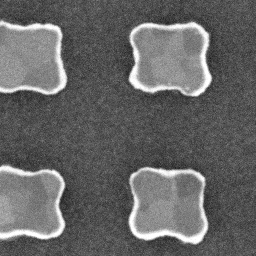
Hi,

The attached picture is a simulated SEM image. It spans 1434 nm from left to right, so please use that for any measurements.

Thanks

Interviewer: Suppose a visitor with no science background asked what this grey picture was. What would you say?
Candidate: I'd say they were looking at raised bodies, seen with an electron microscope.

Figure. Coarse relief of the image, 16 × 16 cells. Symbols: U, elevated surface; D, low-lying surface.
DDDDDDDDDDDDDDDD
UDDDDDDDDDDDDDDD
UUUUDDDDUUUUUDDD
UUUUDDDDUUUUUDDD
UUUUDDDDUUUUUDDD
UUUUDDDDDUUUUDDD
DDDDDDDDDDDDDDDD
DDDDDDDDDDDDDDDD
DDDDDDDDDDDDDDDD
DDDDDDDDDDDDDDDD
DDDDDDDDDDDDDDDD
UUUUDDDDUUUUUDDD
UUUUDDDDUUUUUDDD
UUUUDDDDUUUUUDDD
UUUUDDDDUUUUUDDD
DDDDDDDDDDDDDDDD